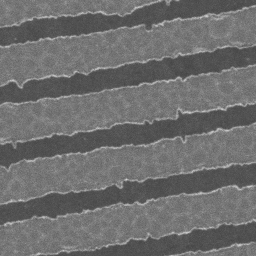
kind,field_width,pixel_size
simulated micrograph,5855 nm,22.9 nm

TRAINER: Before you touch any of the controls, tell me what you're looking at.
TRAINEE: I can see parallel lines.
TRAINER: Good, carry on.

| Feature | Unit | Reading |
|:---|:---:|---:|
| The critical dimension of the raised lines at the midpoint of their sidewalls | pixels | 22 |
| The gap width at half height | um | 0.833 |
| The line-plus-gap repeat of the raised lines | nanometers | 1320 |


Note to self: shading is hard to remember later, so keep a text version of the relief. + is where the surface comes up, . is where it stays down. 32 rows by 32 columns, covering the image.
..................++++++++++++++
................+++++++++++++...
....++++++++++++++++++.....++...
+++++++++++++++...+........++...
++++++++++...................+..
+++.............................
.........................+++++++
...................+++++++++++++
.............++++++++++++++++++.
......+.++++++++++++++++........
.+.+++++++++++++++..............
+++++++++++++...................
+++++...........................
............................++++
......................++++++++++
..............++++++++++++++++++
..........+++++++++++++++++.....
....++++++++++++++++............
+++++++++++++...................
+++++++.........................
++...........................+++
........................++++++++
..................++++++++++++++
.............+++++++++++++++..+.
.....+++++++++++++++++..........
+++++++++++++++++...............
++++++++++......................
++++............................
..........................++++++
....................++++++++++++
..............+++++++++++++++++.
.......+++++++++++++++++.+......